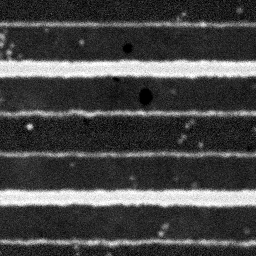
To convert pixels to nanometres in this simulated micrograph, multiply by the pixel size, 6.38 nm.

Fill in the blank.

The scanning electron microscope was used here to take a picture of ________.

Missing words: lines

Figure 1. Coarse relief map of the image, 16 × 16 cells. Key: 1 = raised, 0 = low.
1111111111111111
1111111111111111
0000000000000000
0000000000000000
0000000000000000
0000000000000000
0000000000000000
1111111111111111
1111111111111111
1111111111111111
0000000000000000
0000000000000000
0000000000000000
0000000000000000
0000000000000000
1111111111111111